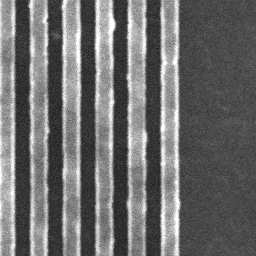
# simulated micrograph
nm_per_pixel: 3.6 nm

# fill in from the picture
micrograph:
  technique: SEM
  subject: parallel lines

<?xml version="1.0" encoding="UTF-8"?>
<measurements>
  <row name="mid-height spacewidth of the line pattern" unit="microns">0.0572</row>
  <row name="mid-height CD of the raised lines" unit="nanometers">60.3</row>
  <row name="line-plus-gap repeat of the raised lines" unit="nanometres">118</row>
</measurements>